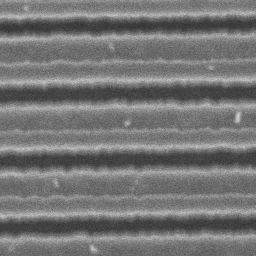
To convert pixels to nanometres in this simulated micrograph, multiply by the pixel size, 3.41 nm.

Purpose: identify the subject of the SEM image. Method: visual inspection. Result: lines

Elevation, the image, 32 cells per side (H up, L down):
HHHHHHHHHHHHHHHHHHHHHHHHHHHHHHHH
HHHHHHHHHHHHHHHHHHHHHHHHHHHHHHHH
LLLLLLLLLLLLLLLLLLLLLLLLLLLLLLLL
LLLLLLLLLLLLLLLLLLLLLLLLLLLLLLLL
LLLHLLHHHHHHHHHHHHHHHHHHHHHHHHHH
HHHHHHHHHHHHHHHHHHHHHHHHHHHHHHHH
HHHHHHHHHHHHHHHHHHHHHHHHHHHHHHHH
HHHHHHHHHHHHHHHHHHHHHHHHHHHHHHHH
HHHHHHHHHHHHHHHHHHHHHHHHHHHHHHHH
HHHHHHHHHHHHHHHHHHHHHHHHHHHHHHHH
HLHLLHLLLLLLLLLLLLLLLLLLLLLLLLLL
LLLLLLLLLLLLLLLLLLLLLLLLLLLLLLLL
LLLLLLLLLLLLLLLLLLLLLLLLLLLLLLLL
HHHHHHHHHHHHHHHHHHHHHHHHHHHHHHHH
HHHHHHHHHHHHHHHHHHHHHHHHHHHHHHHH
HHHHHHHHHHHHHHHHHHHHHHHHHHHHHHHH
HHHHHHHHHHHHHHHHHHHHHHHHHHHHHHHH
HHHHHHHHHHHHHHHHHHHHHHHHHHHHHHHH
HHHHHHHHHHHHHHHHHHHHHHHHHHHLLHHL
LLLLLLLLLLLLLLLLLLLLLLLLLLLLLLLL
LLLLLLLLLLLLLLLLLLLLLLLLLLLLLLLL
HHLLHLHHLHHHHHHHHHHHHHHHHHHHHHHH
HHHHHHHHHHHHHHHHHHHHHHHHHHHHHHHH
HHHHHHHHHHHHHHHHHHHHHHHHHHHHHHHH
HHHHHHHHHHHHHHHHHHHHHHHHHHHHHHHH
HHHHHHHHHHHHHHHHHHHHHHHHHHHHHHHH
HHHHHHHHHHHHHHHHHHHHHHHHHHHHHHHH
LLLLLLLLLLLLLLLLLLLLLLLLLLLLLLLL
LLLLLLLLLLLLLLLLLLLLLLLLLLLLLLLL
LLLLLLLLLHHLLLHHLHHHHHHHHHHHHHHH
HHHHHHHHHHHHHHHHHHHHHHHHHHHHHHHH
HHHHHHHHHHHHHHHHHHHHHHHHHHHHHHHH